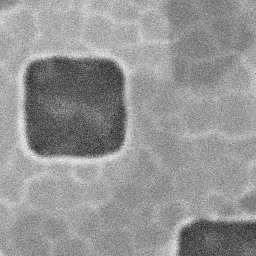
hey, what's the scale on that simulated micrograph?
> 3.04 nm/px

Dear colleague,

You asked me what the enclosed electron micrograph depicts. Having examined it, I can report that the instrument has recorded holes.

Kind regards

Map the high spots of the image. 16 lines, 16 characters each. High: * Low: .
****************
****************
****************
***.************
*.......********
*.......********
*.......********
*.......********
*.......********
**.....*********
****************
****************
****************
****************
***********.....
***********.....